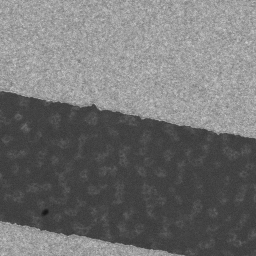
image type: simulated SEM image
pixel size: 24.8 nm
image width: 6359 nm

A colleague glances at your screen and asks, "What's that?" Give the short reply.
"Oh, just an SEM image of one or a few lines or trenches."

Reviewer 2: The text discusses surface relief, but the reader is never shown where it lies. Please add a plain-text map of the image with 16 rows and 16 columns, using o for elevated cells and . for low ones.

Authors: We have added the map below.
oooooooooooooooo
oooooooooooooooo
oooooooooooooooo
oooooooooooooooo
oooooooooooooooo
oooooooooooooooo
....oooooooooooo
..........oooooo
...............o
................
................
................
................
................
ooo.............
ooooooooo.......